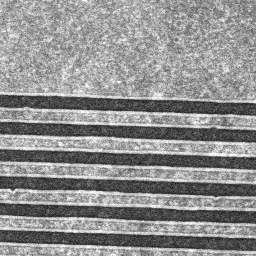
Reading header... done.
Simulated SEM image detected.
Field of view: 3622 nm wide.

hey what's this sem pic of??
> parallel lines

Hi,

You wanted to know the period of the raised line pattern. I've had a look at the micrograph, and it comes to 383 nanometers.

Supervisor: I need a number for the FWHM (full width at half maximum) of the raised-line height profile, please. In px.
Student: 11.7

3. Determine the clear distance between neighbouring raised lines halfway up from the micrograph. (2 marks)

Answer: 0.214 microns